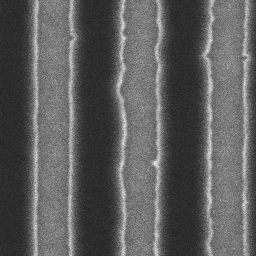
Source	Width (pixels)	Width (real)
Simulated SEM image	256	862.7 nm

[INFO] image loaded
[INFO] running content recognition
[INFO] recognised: one or a few lines or trenches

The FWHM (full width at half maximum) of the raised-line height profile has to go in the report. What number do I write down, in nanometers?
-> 182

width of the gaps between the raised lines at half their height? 111 nm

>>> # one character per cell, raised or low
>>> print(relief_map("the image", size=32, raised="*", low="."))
*****....*******....*******....*
*****....******.....*******....*
*****....******.....*******....*
*****....******.....******.....*
*****....******.....******.....*
*****....******.....******....**
*****....******....*******....**
*****....******.....******.....*
****.....******.....******.....*
*****....******.....******.....*
*****....******.....******....**
*****....******.....******....**
*****....******.....******....**
*****....******.....******.....*
*****....*******....******.....*
*****....*******....******.....*
*****....*******....******.....*
*****....*******....******.....*
*****....******.....******.....*
*****....*******....******....**
*****....******....*******....**
*****....******.....******....**
*****....******.....******.....*
*****....******.....******.....*
*****....*******....******....**
*****....*******...*******....**
****.....*******....******.....*
*****....*******....******.....*
*****....*******...*******.....*
*****....******....*******.....*
*****....*******...*******.....*
*****....*******....******.....*